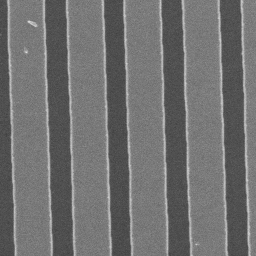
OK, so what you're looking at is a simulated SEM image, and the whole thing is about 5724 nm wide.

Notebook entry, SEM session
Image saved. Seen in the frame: lines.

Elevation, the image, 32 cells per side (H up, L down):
LHHHHHLLHHHHHLLLHHHHLLLHHHHLLLHH
LHHHHHLLHHHHHLLLHHHHLLLHHHHLLLHH
LHHHHHLLHHHHHLLLHHHHLLLHHHHLLLHH
LHHHHHLLHHHHHLLLHHHHLLLHHHHLLLHH
LHHHHHLLHHHHHLLLHHHHLLLHHHHHLLHH
LHHHHHLLHHHHHLLLHHHHLLLHHHHHLLHH
LHHHHHLLLHHHHLLLHHHHLLLHHHHHLLHH
LHHHHHLLLHHHHLLLHHHHLLLHHHHHLLHH
LHHHHHLLLHHHHLLLHHHHLLLHHHHHLLHH
LHHHHHLLLHHHHLLLHHHHLLLHHHHHLLHH
LHHHHHLLLHHHHLLLHHHHLLLHHHHHLLHH
LHHHHHLLLHHHHLLLHHHHLLLHHHHHLLHH
LHHHHHLLLHHHHLLLHHHHLLLHHHHHLLLH
LHHHHHLLLHHHHLLLHHHHHLLHHHHHLLLH
LHHHHHLLLHHHHLLLHHHHHLLHHHHHLLLH
LHHHHHLLLHHHHLLLHHHHHLLHHHHHLLLH
LHHHHHLLLHHHHLLLHHHHHLLHHHHHLLLH
LHHHHHLLLHHHHLLLHHHHHLLHHHHHLLLH
LHHHHHLLLHHHHLLLHHHHHLLHHHHHLLLH
LHHHHHLLLHHHHLLLHHHHHLLHHHHHLLLH
LLHHHHLLLHHHHHLLHHHHHLLHHHHHLLLH
LLHHHHLLLHHHHHLLHHHHHLLHHHHHLLLH
LLHHHHLLLHHHHHLLHHHHHLLHHHHHLLLH
LLHHHHLLLHHHHHLLHHHHHLLLHHHHLLLH
LLHHHHLLLHHHHHLLHHHHHLLLHHHHLLLH
LLHHHHLLLHHHHHLLHHHHHLLLHHHHLLLH
LLHHHHLLLHHHHHLLHHHHHLLLHHHHLLLH
LLHHHHLLLHHHHHLLHHHHHLLLHHHHLLLH
LLHHHHLLLHHHHHLLHHHHHLLLHHHHLLLH
LLHHHHLLLHHHHHLLHHHHHLLLHHHHLLLH
LLHHHHLLLHHHHHLLHHHHHLLLHHHHLLLH
LLHHHHLLLHHHHHLLHHHHHLLLHHHHLLLH